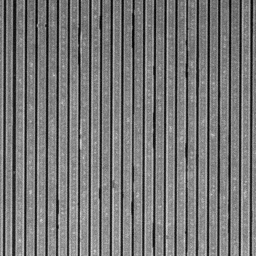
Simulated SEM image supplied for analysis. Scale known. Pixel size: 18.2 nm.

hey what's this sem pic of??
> parallel lines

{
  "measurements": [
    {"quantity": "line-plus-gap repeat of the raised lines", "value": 196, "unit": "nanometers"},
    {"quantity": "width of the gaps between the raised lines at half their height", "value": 52.4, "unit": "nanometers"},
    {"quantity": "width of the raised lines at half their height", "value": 0.137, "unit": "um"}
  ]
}